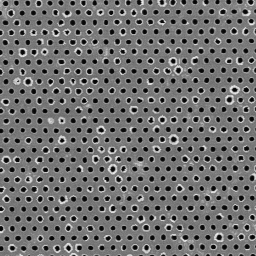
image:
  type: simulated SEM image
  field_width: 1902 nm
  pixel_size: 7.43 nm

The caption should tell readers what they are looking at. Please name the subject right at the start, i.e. a regular array of holes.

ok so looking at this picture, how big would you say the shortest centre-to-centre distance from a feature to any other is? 80.3 nanometres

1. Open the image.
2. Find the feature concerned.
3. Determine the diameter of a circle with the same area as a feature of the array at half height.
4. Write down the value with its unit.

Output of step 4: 34.5 nanometers